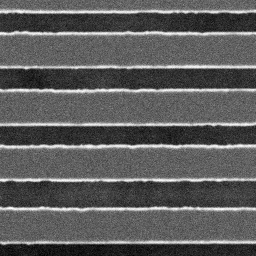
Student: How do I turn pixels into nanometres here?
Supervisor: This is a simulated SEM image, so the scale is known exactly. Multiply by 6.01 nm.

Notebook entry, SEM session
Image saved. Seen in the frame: lines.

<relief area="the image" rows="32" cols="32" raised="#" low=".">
################################
..################..##.#..##.##.
................................
................................
################################
################################
################################
################################
...#.....#......................
................................
................................
################################
################################
################################
################################
################################
................................
................................
################################
################################
################################
################################
################################
................................
................................
................................
################################
################################
################################
################################
#...............................
................................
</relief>